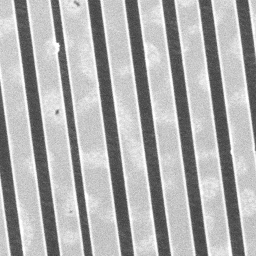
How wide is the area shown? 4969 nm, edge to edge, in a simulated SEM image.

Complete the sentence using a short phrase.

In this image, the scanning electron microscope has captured parallel lines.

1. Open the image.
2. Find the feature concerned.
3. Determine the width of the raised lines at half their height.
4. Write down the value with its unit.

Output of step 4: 447 nm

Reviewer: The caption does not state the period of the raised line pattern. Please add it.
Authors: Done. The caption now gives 705 nanometers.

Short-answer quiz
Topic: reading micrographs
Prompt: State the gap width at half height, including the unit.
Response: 260 nm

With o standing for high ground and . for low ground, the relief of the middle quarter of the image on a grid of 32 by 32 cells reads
.ooooooo....ooooo....ooooo....oo
.ooooooo....ooooo....oooooo...oo
.ooooooo....ooooo....oooooo...oo
.ooooooo....oooooo...oooooo...oo
..ooooooo...oooooo...oooooo...oo
..ooooooo...oooooo...oooooo....o
..ooooooo...oooooo...oooooo....o
..ooooooo...oooooo....ooooo....o
..ooooooo....ooooo....oooooo...o
..ooooooo....ooooo....oooooo...o
..ooooooo....ooooo....oooooo...o
...oooooo....oooooo...oooooo...o
...oooooo....oooooo...oooooo....
...ooooooo...oooooo...oooooo....
o..ooooooo...oooooo....ooooo....
o..ooooooo...oooooo....ooooo....
o..ooooooo....ooooo....oooooo...
o..ooooooo....ooooo....oooooo...
o..ooooooo....oooooo...oooooo...
o...oooooo....oooooo...oooooo...
o...ooooooo...oooooo...oooooo...
o...ooooooo...oooooo...oooooo...
oo..ooooooo...oooooo....ooooo...
oo..ooooooo....ooooo....ooooo...
oo..ooooooo....ooooo....oooooo..
oo..ooooooo....ooooo....oooooo..
oo..ooooooo....oooooo...oooooo..
oo...oooooo....oooooo...oooooo..
oo...ooooooo...oooooo...oooooo..
oo...ooooooo...oooooo....ooooo..
ooo..ooooooo...oooooo....ooooo..
ooo..ooooooo....ooooo....oooooo.